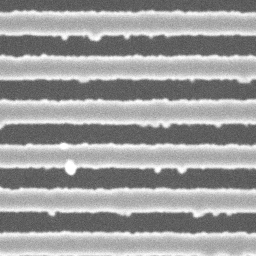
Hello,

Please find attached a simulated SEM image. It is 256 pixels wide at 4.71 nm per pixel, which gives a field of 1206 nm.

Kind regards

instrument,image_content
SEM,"lines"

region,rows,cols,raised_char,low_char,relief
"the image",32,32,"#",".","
................................
..###......#.....###..#....#....
################################
################################
........#..##..#................
................................
................................
################################
################################
################################
................................
................................
...................##...........
################################
################################
#................####......#....
................................
................................
################################
################################
################################
........#.......................
................................
................................
################################
################################
......#....#..###.......######..
................................
................................
################################
################################
################################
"